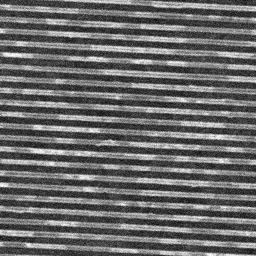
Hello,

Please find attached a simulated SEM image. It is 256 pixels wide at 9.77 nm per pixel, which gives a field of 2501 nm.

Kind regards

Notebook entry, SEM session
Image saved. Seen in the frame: parallel lines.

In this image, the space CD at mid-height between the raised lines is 79.3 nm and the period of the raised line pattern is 116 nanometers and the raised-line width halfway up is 43.9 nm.